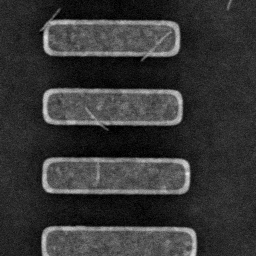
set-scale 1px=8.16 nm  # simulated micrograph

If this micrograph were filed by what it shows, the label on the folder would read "groups of lines, slits or small figures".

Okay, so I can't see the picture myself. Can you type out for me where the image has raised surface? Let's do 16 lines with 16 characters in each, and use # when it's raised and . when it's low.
................
...########.....
...########.....
................
................
................
...########.....
...########.....
................
................
...#########....
...#########....
................
................
...#########....
...#########....